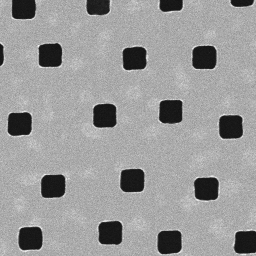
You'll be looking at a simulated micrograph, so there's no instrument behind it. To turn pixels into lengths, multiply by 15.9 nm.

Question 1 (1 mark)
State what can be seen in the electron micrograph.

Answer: a regular array of holes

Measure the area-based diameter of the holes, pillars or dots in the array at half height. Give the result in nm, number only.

411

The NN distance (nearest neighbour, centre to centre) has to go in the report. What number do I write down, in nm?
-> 988